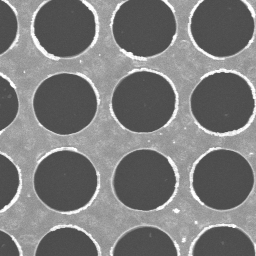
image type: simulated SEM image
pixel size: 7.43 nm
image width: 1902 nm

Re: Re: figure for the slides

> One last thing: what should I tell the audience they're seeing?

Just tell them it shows holes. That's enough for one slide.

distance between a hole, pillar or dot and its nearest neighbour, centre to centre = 0.572 micrometres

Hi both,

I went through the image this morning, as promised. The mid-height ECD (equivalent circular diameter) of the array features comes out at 463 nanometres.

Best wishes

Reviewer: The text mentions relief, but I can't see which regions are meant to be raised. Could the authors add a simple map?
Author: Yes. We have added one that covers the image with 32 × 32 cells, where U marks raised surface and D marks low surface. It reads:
DUUUUUDDDDDUUUUDDDDDDUUUUDDDDDDU
DDUUUDDDDDDUUUUDDDDDDDUUDDDDDDDU
DDUUDDDDDDDDUUDDDDDDDDUUDDDDDDDD
DDUUDDDDDDDDUUDDDDDDDDUUDDDDDDDD
DDUUDDDDDDDDUUDDDDDDDDUUDDDDDDDD
DUUUUDDDDDDUUUUDDDDDDUUUUDDDDDDU
DUUUUUDDDDUUUUUUDDDDUUUUUUDDDDUU
UUUUUUUUUUUUUUUUUUUUUUUUUUUUUUUU
UUUUUUUUUUUUUUUUUUUUUUUUUUUUUUUU
UUUUUUUDDDUUUUUUDDDDUUUUUUDDDDUU
DUUUUDDDDDDUUUUDDDDDDUUUUDDDDDDU
DDUUDDDDDDDDUUDDDDDDDDUUDDDDDDDD
DDUUDDDDDDDDUUDDDDDDDDUUDDDDDDDD
DDUUDDDDDDDDUUDDDDDDDDUUDDDDDDDD
DDUUDDDDDDDDUUDDDDDDDUUUDDDDDDDU
DUUUUDDDDDDUUUUDDDDDDUUUUDDDDDDU
UUUUUUUDDDUUUUUUUDDUUUUUUUUDUUUU
UUUUUUUUUUUUUUUUUUUUUUUUUUUUUUUU
UUUUUUUUUUUUUUUUUUUUUUUUUUUUUUUU
DUUUUUDDDDUUUUUUDDDDUUUUUUDDDDUU
DDUUUDDDDDDDUUUDDDDDDUUUUDDDDDDU
DDUUDDDDDDDDUUDDDDDDDDUUDDDDDDDD
DDUUDDDDDDDDUUDDDDDDDDUUDDDDDDDD
DDUUDDDDDDDDUUDDDDDDDDUUDDDDDDDD
DDUUUDDDDDDDUUUDDDDDDUUUUDDDDDDU
DUUUUUDDDDDUUUUDDDDDUUUUUUDDDDUU
UUUUUUUUUUUUUUUUUUUUUUUUUUUUUUUU
UUUUUUUUUUUUUUUUUUUUUUUUUUUUUUUU
UUUUUUUUDUUUUUUUUDDUUUUUUUUDDUUU
DUUUUUDDDDDUUUUDDDDDDUUUUDDDDDDU
DDUUUDDDDDDDUUUDDDDDDDUUDDDDDDDD
DDUUDDDDDDDDUUDDDDDDDDUUDDDDDDDD